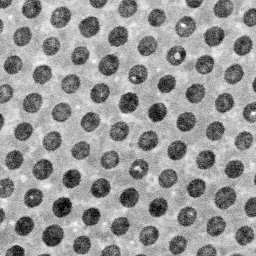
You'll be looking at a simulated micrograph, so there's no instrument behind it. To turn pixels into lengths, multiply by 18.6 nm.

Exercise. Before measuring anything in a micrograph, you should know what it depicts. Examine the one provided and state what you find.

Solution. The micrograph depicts a regular array of holes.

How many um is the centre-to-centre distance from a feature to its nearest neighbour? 0.554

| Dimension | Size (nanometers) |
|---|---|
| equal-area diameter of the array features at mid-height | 381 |